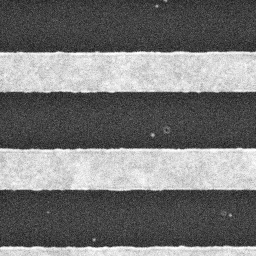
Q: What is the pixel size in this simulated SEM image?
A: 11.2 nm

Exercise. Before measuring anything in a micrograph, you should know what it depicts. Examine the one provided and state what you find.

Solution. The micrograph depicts lines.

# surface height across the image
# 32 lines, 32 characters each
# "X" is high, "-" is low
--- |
--------------------------------
--------------------------------
--------------------------------
--------------------------------
--------------------------------
--------------------------------
--------------------------------
XXXXXXXXXXXXXXXXXXXXXXXXXXXXXXXX
XXXXXXXXXXXXXXXXXXXXXXXXXXXXXXXX
XXXXXXXXXXXXXXXXXXXXXXXXXXXXXXXX
XXXXXXXXXXXXXXXXXXXXXXXXXXXXXXXX
--------------------------------
--------------------------------
--------------------------------
--------------------------------
--------------------------------
--------------------------------
--------------------------------
--------------------------------
XXXXXXXXXXXXXXXXXXXXXXXXXXXXXXXX
XXXXXXXXXXXXXXXXXXXXXXXXXXXXXXXX
XXXXXXXXXXXXXXXXXXXXXXXXXXXXXXXX
XXXXXXXXXXXXXXXXXXXXXXXXXXXXXXXX
XXXXXXXXXXXXXXXXXXXXXXXXXXXXXXXX
--------------------------------
--------------------------------
--------------------------------
--------------------------------
--------------------------------
--------------------------------
--------------------------------
XXXXXXXXXXXXXXXXXXXXXXXXXXXXXXXX